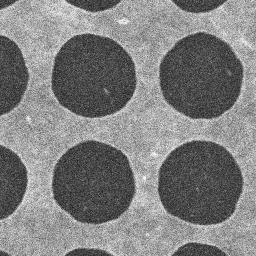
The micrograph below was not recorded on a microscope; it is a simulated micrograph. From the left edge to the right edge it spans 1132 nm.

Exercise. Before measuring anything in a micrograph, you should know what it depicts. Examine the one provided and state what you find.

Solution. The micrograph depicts holes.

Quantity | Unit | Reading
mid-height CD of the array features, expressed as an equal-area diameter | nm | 376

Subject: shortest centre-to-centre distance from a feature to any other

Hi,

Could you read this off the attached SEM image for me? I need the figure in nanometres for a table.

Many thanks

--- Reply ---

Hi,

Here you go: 471